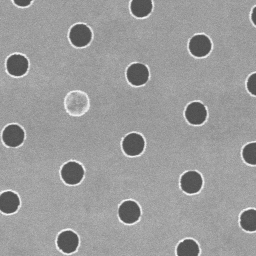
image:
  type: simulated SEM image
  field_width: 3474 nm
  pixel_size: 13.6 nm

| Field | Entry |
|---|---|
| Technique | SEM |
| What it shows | a regular array of holes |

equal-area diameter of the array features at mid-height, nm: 306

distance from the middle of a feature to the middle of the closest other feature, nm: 925